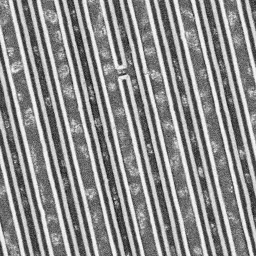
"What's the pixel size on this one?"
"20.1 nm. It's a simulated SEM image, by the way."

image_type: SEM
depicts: parallel lines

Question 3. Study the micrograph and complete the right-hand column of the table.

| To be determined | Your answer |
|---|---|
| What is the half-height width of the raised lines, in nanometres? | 171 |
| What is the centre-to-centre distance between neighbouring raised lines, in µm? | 0.445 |